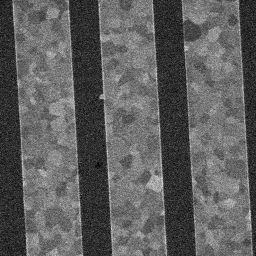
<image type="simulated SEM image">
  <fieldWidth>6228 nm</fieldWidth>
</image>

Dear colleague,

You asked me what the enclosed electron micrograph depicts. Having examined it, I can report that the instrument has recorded one or a few lines or trenches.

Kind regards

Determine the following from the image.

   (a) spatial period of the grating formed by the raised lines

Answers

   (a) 2060 nanometers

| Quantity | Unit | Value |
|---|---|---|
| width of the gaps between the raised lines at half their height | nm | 735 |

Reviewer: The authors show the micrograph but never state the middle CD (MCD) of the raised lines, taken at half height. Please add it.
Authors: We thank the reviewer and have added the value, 1330 nm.